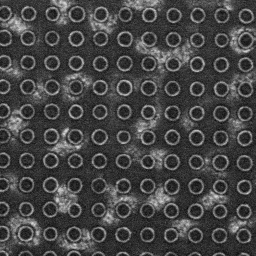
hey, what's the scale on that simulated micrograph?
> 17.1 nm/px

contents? a regular array of raised bodies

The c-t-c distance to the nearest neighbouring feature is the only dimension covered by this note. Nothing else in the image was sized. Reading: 410 nm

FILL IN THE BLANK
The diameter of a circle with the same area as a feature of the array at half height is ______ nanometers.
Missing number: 239